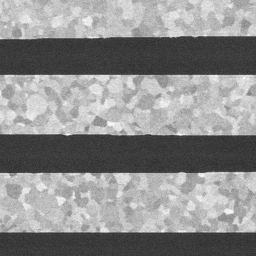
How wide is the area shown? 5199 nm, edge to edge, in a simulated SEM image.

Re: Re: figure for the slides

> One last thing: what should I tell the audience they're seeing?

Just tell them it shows lines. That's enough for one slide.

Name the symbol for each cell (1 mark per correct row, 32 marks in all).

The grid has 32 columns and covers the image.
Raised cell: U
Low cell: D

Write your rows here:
UUUUUUUUUUUUUUUUUUUUUUUUUUUUUUUU
UUUUUUUUUUUUUUUUUUUUUUUUUUUUUUUU
UUUUUUUUUUUUUUUUUUUUUUUUUUUUUUUU
UUUUUUUUUUUUUUUUUUUUUUUUUUUUUUUU
UUUUUUUUUUUUUUUUUUUUUUDDUDDDDDDD
DDDDDDDDDDDDDDDDDDDDDDDDDDDDDDDD
DDDDDDDDDDDDDDDDDDDDDDDDDDDDDDDD
DDDDDDDDDDDDDDDDDDDDDDDDDDDDDDDD
DDDDDDDDDDDDDDDDDDDDDDDDDDDDDDDD
UUUUUUUUUUUUUUUUUUUUUUUUUUUUUUUU
UUUUUUUUUUUUUUUUUUUUUUUUUUUUUUUU
UUUUUUUUUUUUUUUUUUUUUUUUUUUUUUUU
UUUUUUUUUUUUUUUUUUUUUUUUUUUUUUUU
UUUUUUUUUUUUUUUUUUUUUUUUUUUUUUUU
UUUUUUUUUUUUUUUUUUUUUUUUUUUUUUUU
UUUUUUUUUUUUUUUUUUUUUUUUUUUUUUUU
UUUUUUUUUUUUUUUUUUUUUUUUUUUUUUUU
DDDDDDDDDDDDDDDDDDDDDDDDDDDDDDDD
DDDDDDDDDDDDDDDDDDDDDDDDDDDDDDDD
DDDDDDDDDDDDDDDDDDDDDDDDDDDDDDDD
DDDDDDDDDDDDDDDDDDDDDDDDDDDDDDDD
DDDDDDDDDDDDDDDDDDDDDDDDDDDDDDDD
UUUUUUUUUUUUUUUUUUUUUUUUUUUUUUUU
UUUUUUUUUUUUUUUUUUUUUUUUUUUUUUUU
UUUUUUUUUUUUUUUUUUUUUUUUUUUUUUUU
UUUUUUUUUUUUUUUUUUUUUUUUUUUUUUUU
UUUUUUUUUUUUUUUUUUUUUUUUUUUUUUUU
UUUUUUUUUUUUUUUUUUUUUUUUUUUUUUUU
UUUUUUUUUUUUUUUUUUUUUUUUUUUUUUUU
DDDDDDDDDDDDDDDDDDDDDDDDDDDDDDDD
DDDDDDDDDDDDDDDDDDDDDDDDDDDDDDDD
DDDDDDDDDDDDDDDDDDDDDDDDDDDDDDDD